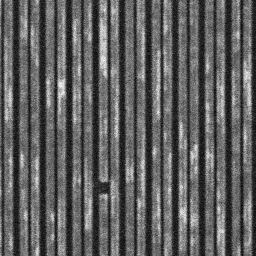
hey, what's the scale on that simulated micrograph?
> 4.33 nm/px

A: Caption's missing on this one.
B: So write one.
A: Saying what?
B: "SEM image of parallel lines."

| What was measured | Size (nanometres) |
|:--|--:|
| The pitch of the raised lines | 57.5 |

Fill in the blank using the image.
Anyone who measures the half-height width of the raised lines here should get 7.62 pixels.